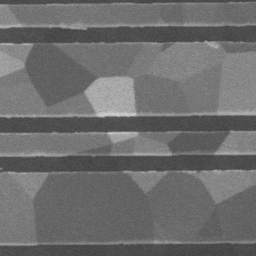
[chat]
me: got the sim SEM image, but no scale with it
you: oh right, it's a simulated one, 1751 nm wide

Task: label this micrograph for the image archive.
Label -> lines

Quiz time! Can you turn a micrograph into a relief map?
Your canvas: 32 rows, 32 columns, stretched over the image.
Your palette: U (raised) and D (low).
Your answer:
DDDDDDDDDDDDDDUUUDDUUUUUUUUUUUUU
UUUUUUUUUUUUUUUUUUUUUUUUUUUUUUUU
UUUUUUUUUUUUUUUUUUUUUUUUUUUUUUUU
DDDDDDDDUUDDDDDDDDDDDDDDDDDDDDDD
DDDDDDDDDDDDDDDDDDDDDDDDDDDDDDDD
UUUUUUUUUUUUUUUUUUUUUUUUUUUUUUUU
UUUUUUUUUUUUUUUUUUUUUUUUUUUUUUUU
UUUUUUUUUUUUUUUUUUUUUUUUUUUUUUUU
UUUUUUUUUUUUUUUUUUUUUUUUUUUUUUUU
UUUUUUUUUUUUUUUUUUUUUUUUUUUUUUUU
UUUUUUUUUUUUUUUUUUUUUUUUUUUUUUUU
UUUUUUUUUUUUUUUUUUUUUUUUUUUUUUUU
UUUUUUUUUUUUUUUUUUUUUUUUUUUUUUUU
UUUUUUUUUUUUUUUUUUUUUUUUUUUUUUUU
UUUUUUDDDDDDDDDDDDDDDDDDDDDDDDDD
DDDDDDDDDDDDDDDDDDDDDDDDDDDDDDDD
DDDDDDDDDDDDDDDDDDUDDUUUUUUUUUUU
UUUUUUUUUUUUUUUUUUUUUUUUUUUUUUUU
UUUUUUUUUUUUUUUUUUUUUUUUUUUUUUUU
DUUDDDDDDDDDDDDDDDDDDDDDDDDDDDDD
DDDDDDDDDDDDDDDDDDDDDDDDDDDDDDDD
DDDDDDDDDDDDDDDUUDUUUUUUUUUUUUUU
UUUUUUUUUUUUUUUUUUUUUUUUUUUUUUUU
UUUUUUUUUUUUUUUUUUUUUUUUUUUUUUUU
UUUUUUUUUUUUUUUUUUUUUUUUUUUUUUUU
UUUUUUUUUUUUUUUUUUUUUUUUUUUUUUUU
UUUUUUUUUUUUUUUUUUUUUUUUUUUUUUUU
UUUUUUUUUUUUUUUUUUUUUUUUUUUUUUUU
UUUUUUUUUUUUUUUUUUUUUUUUUUUUUUUU
UUUUUUUUUUUUUUUUUUUUUUUUUUUUUUUU
UUUUUUUUUUUUUDDDDDDDDDDDDDDDDDDD
DDDDDDDDDDDDDDDDDDDDDDDDDDDDDDDD